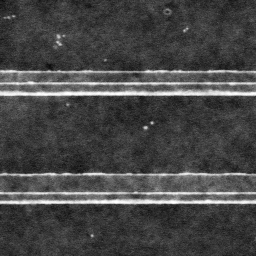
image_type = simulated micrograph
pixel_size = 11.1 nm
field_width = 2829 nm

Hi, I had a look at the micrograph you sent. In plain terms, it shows lines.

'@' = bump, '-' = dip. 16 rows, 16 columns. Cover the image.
----------------
----------------
----------------
----------------
@@@@@@@@@@@@@@@@
@@@@@@@@@@@@@@@@
----------------
----------------
----------------
----------------
----------------
@@@@@@@@@@@@@@@@
@@@@@@@@@@@@@@@@
----------------
----------------
----------------